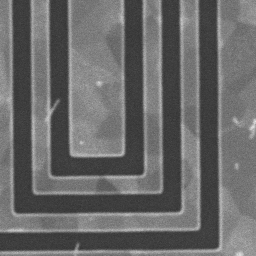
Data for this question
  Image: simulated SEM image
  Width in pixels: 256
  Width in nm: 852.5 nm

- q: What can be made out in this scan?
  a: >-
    groups of lines, slits or small figures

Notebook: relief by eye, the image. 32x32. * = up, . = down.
*...**...******...**...**..*****
*...**...******...**...**..*****
*...**...******...**...**..*****
*...**...******...**...**..*****
*...**...******...**...**..*****
*...**...******...**...**..*****
*...**...******...**...**..*****
*...**...******...**...**..*****
*...**...******...**...**..*****
*...**...******...**...**..*****
*...**...******...**...**..*****
*...**...******...**...**..*****
*...**...******...**...**..*****
*...**...******...**...**..*****
*...**...******...**...**..*****
*...**...******...**...**..*****
*...**...******...**...**..*****
*...**...******...**...**..*****
*...**...******...**...**...****
*...**...***......**...**...****
*...**............**...**...****
*...**............**...**...****
*...****************...**...****
*...****************...**...****
**.....................**...****
**.....................**...****
**....................***...****
*************************...****
*************************...****
............................****
............................****
.........*..****....************